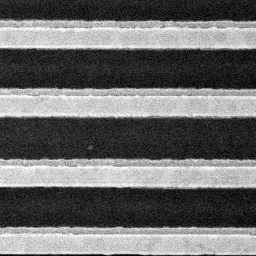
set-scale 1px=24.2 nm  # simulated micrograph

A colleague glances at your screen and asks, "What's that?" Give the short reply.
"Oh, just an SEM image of lines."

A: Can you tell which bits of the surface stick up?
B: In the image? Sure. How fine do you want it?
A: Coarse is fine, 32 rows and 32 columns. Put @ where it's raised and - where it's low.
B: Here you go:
--------------------------------
--------------------------------
--------------------------------
@@@@@@@@@@@@@@@@@@@@@@@@@@@@@@@@
@@@@@@@@@@@@@@@@@@@@@@@@@@@@@@@@
@@@@@@@@@@@@@@@@@@@@@@@@@@@@@@@@
--------------------------------
--------------------------------
--------------------------------
--------------------------------
--------------------------------
@@@@@@@@@@@@@@@@@@@@@@@@@@@@@@@@
@@@@@@@@@@@@@@@@@@@@@@@@@@@@@@@@
@@@@@@@@@@@@@@@@@@@@@@@@@@@@@@@@
@-@@-@---@@@@@@@@@@--@-@@@@@@@--
--------------------------------
--------------------------------
--------------------------------
--------------------------------
--------------------------------
@@@@@@@@@@@@@@@@@@@@@@@@@@@@@@@@
@@@@@@@@@@@@@@@@@@@@@@@@@@@@@@@@
@@@@@@@@@@@@@@@@@@@@@@@@@@@@@@@@
--------------------------------
--------------------------------
--------------------------------
--------------------------------
--------------------------------
@@@@-@@@@@----@@----@@@@@-------
@@@@@@@@@@@@@@@@@@@@@@@@@@@@@@@@
@@@@@@@@@@@@@@@@@@@@@@@@@@@@@@@@
@@@@@@@@@@@@@@@@@@@@@@@@@@@@@@@@